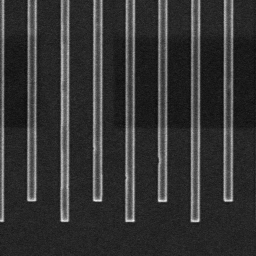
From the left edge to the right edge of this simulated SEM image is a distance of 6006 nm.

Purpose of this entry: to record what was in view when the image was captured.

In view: parallel lines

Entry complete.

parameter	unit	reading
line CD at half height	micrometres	0.191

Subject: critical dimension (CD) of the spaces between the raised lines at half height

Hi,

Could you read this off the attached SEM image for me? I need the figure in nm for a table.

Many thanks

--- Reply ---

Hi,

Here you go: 592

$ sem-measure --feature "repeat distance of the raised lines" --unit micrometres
0.767